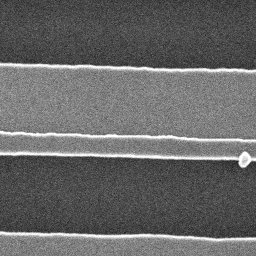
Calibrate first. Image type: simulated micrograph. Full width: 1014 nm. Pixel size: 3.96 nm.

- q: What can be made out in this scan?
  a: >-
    lines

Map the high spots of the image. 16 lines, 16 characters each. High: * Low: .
................
................
................
................
****************
****************
****************
****************
****************
****************
................
................
................
................
................
****************